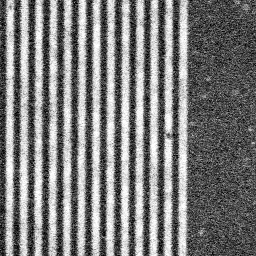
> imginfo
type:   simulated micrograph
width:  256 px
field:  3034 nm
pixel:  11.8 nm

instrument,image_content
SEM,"parallel lines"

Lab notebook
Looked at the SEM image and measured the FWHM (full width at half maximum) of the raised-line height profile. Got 63.7 nm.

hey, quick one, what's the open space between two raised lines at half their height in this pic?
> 0.107 um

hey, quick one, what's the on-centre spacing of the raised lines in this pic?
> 171 nm